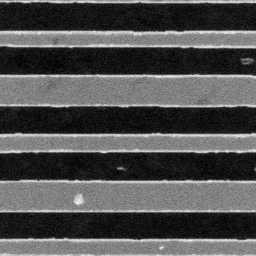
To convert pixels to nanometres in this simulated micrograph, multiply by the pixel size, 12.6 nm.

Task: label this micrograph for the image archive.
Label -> lines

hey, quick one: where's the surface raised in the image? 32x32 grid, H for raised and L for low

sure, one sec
LLLLLLLLLLLLLLLLLLLLLLLLLLLLLLLL
LLLLLLLLLLLLLLLLLLLLLLLLLLLLLLLL
LLLLLLLLLLLLLLLLLLLLLLLLLLLLLLLL
LLLLLLLLLLLLLLLLLLLLLLLLLLLLLLLL
HHHHHHHHHHHHHHHHHHHHHHHHHHHHHHHH
HHHHHHHHHHHHHHHHHHHHHHHHHHHHHHHH
LLLLLLLLLLLLLLLLLLLLLLLLLLLLLLLL
LLLLLLLLLLLLLLLLLLLLLLLLLLLLLLLL
LLLLLLLLLLLLLLLLLLLLLLLLLLLLLLLL
HHLHHHHHHHHHHHHHHHHLLLHHHHHHHHHL
HHHHHHHHHHHHHHHHHHHHHHHHHHHHHHHH
HHHHHHHHHHHHHHHHHHHHHHHHHHHHHHHH
HHHHHHHHHHHHHHHHHHHHHHHHHHHHHHHH
LLLLLLLLLLLLLLLLLLLLLLLLLLLLLLLL
LLLLLLLLLLLLLLLLLLLLLLLLLLLLLLLL
LLLLLLLLLLLLLLLLLLLLLLLLLLLLLLLL
LLLLLLLLLLLLLLLLLLLLLLLLLLLLLLLL
HHHHHHHHHHHHHHHHHHHHHHHHHHHHHHHH
HHHHHHHHHHHHHHHHHHHHHHHHHHHHHHHH
LLLLLLLLLLLLLLLLLLLLLLLLLLLLLLLL
LLLLLLLLLLLLLLLLLLLLLLLLLLLLLLLL
LLLLLLLLLLLLLLLLLLLLLLLLLLLLLLLL
LLLLLLLLLLLLLLLLLLLLLLLLLLLLLLLL
HHHHHHHHHHHHHHHHHHHHHHHHHHHHHHHH
HHHHHHHHHHHHHHHHHHHHHHHHHHHHHHHH
HHHHHHHHHHHHHHHHHHHHHHHHHHHHHHHH
LLLLLLLLLLLLLLLLLLLLLLLLLLLLLLLL
LLLLLLLLLLLLLLLLLLLLLLLLLLLLLLLL
LLLLLLLLLLLLLLLLLLLLLLLLLLLLLLLL
LLLLLLLLLLLLLLLLLLLLLLLLLLLLLLLL
HHHHHHHHHHHHHHHHHHHHHHHHHHHHHHHH
HHHHHHHHHHHHHHHHHHHHHHHHHHHHHHHH